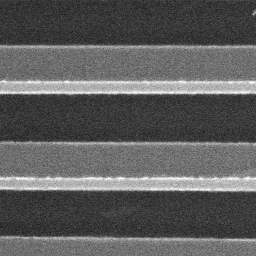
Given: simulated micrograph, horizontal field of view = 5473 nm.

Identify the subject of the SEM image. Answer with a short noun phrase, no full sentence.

lines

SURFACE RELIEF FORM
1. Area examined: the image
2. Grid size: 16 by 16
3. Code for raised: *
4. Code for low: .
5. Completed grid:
................
................
................
****************
****************
****************
................
................
................
****************
****************
****************
................
................
................
****************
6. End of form